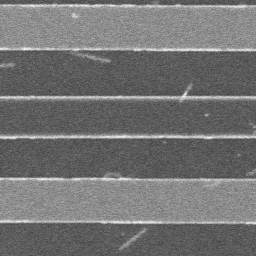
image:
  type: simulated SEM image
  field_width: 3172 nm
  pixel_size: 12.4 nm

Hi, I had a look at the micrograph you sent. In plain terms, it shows lines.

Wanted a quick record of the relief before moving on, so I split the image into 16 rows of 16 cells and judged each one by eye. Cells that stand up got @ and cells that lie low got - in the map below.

@@@@@@@@@@@@@@@@
@@@@@@@@@@@@@@@@
@@@@@@@@@@@@@@@@
----------------
----------------
----------------
@@@@@@@@@@@@@@@@
@@@@@@@@@@@@@@@@
@@@@@@@@@@@@@@@@
----------------
----------------
@@@@@@@@@@@@@@@@
@@@@@@@@@@@@@@@@
@@@@@@@@@@@@@@@@
----------------
----------------